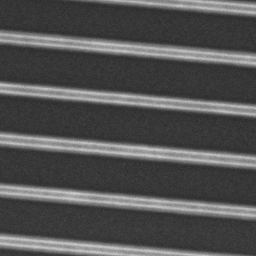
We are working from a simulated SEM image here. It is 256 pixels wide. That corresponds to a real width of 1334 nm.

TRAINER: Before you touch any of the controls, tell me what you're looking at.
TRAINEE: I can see parallel lines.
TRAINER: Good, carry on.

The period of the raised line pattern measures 50.7 px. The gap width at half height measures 210 nanometers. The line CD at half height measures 53.8 nm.